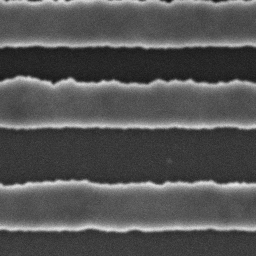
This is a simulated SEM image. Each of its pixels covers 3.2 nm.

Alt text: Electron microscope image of lines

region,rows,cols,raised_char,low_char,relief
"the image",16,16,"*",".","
****************
****************
****************
................
................
****************
****************
****************
................
................
................
.*****..********
****************
****************
................
................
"